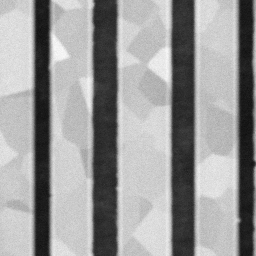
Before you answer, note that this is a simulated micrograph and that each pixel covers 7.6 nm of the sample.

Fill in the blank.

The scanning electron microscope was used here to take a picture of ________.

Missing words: one or a few lines or trenches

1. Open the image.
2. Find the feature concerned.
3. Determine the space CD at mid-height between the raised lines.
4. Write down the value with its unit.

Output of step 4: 202 nm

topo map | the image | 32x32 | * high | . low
****...****....******....*****..
****...****....******....*****..
****...****....******....****...
****...****....******....*****..
****...****....******....*****..
****...****....******....*****..
****...****....******....*****..
****..*****....******....*****..
****..*****....******....*****..
****..*****....******....*****..
****...****....******....*****..
****...****....******....****...
****...****....******....****...
****...****....******....*****..
****...****....******....*****..
****...****....******....*****..
****...****....******....*****..
****...****....******....*****..
****...****....******....*****..
****...****....******....*****..
****...****....******....*****..
****...****....******....****...
****...****....******....****...
****...****....******....****...
****...****....******....****...
****...****....******....****...
****...****....******....*****..
****...****....******....*****..
****..*****....******....*****..
****...****....******....*****..
****...****....******....*****..
****...****....******....*****..